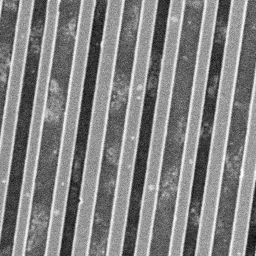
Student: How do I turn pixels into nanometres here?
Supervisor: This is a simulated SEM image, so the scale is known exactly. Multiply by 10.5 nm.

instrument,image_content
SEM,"parallel lines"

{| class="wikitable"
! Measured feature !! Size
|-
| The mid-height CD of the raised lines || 149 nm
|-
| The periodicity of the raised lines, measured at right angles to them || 318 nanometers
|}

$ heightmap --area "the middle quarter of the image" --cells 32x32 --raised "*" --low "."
..***....****....****...****....
..***....***.....****...****....
..***...****.....****...****....
..***...****.....****...***.....
..***...****.....****...***.....
.****...****.....***....***.....
.****...****.....***....***.....
.***....****....****...****.....
.***....***.....****...****.....
.***...****.....****...****.....
.***...****.....****...***......
.***...****.....****...***......
****...****.....***....***.....*
****...****.....***....***.....*
***....****....****...****.....*
***....***.....****...****.....*
***...****.....****...****.....*
***...****.....****...***......*
***...****.....****...***......*
***...****.....***....***.....**
***...****.....***....***.....**
**....****....****...****.....**
**....***.....****...****.....**
**...****.....****...****.....**
**...****.....****...***......**
**...****.....***....***......**
**...****.....***....***.....***
**...****.....***....***.....***
*....****....****...****.....***
*....***.....****...****.....***
*...****.....****...****.....***
*...****.....****...***......***